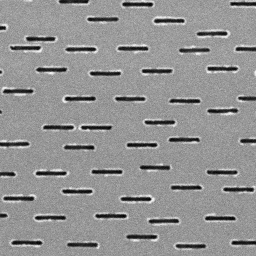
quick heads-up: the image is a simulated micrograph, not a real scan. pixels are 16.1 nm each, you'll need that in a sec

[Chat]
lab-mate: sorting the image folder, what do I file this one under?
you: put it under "a regular array of holes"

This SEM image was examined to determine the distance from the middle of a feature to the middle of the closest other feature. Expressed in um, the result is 0.528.